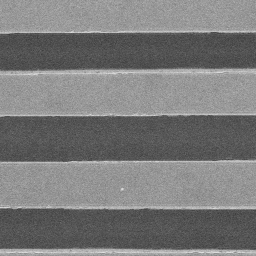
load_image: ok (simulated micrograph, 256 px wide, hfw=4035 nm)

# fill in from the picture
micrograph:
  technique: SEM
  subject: lines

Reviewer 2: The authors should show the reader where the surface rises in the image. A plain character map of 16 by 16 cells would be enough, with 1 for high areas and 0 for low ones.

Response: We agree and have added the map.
1111111111111111
1111111111111111
0000000000000000
0000000000000000
0000000000000000
1111111111111111
1111111111111111
0000000000000000
0000000000000000
0000000000000000
1111111111111111
1111111111111111
1111111111111111
0000000000000000
0000000000000000
0000000000000000